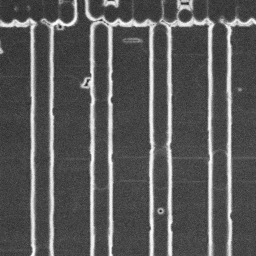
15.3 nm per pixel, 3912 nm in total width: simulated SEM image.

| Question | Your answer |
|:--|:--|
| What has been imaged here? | wiring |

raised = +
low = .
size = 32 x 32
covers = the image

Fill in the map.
+++++++++..++++++++++++.++++++++
+++++++++..+++++++++++++++++++++
+++++++++...++++++++++++++++++++
....+++....+++.....++.....+++...
....+++....+++.....++.....+++...
....++.....+++.....++.....+++...
....++.....+++.....++.....+++...
....++.....+++.....++.....+++...
....++.....+++.....++.....+++...
....++.....+++.....++.....+++...
....++.....+++.....++.....+++...
....++.....+++.....++.....+++...
....++......++.....++.....+++...
....++.....+++.....++.....+++...
....++.....+++.....++.....+++...
....++.....+++.....++.....+++...
....++.....+++.....++.....+++...
....++......++.....++.....+++...
....++.....+++.....++.....+++...
....+++....+++.....++.....+++...
....+++....+++.....++.....+++...
....++.....+++.....++.....+++...
....++.....+++.....++.....+++...
....++.....+++.....++.....+++...
....+++....+++.....++.....+++...
....+++....+++.....++.....+++...
....+++....+++.....++.....+++...
....++.....+++.....++.....+++...
....++.....+++.....++.....+++...
....++......++.....++.....+++...
....++.....+++.....++.....+++...
....+++....+++.....++.....+++...